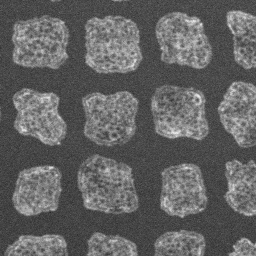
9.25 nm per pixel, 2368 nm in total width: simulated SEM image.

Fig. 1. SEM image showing a regular array of raised bodies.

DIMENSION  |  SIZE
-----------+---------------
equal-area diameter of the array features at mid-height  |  484 nanometers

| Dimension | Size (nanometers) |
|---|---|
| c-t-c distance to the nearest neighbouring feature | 654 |